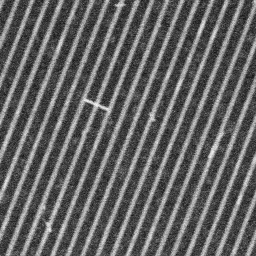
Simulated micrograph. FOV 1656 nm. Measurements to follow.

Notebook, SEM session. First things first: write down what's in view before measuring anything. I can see parallel lines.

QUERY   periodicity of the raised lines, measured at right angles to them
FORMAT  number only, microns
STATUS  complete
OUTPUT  0.0904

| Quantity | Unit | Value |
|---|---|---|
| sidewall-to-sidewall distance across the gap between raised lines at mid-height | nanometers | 65.5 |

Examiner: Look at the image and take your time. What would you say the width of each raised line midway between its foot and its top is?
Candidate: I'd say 24.8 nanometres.